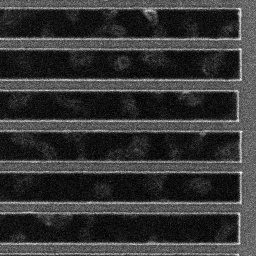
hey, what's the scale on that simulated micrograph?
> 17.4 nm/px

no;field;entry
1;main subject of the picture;parallel lines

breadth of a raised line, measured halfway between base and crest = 0.549 µm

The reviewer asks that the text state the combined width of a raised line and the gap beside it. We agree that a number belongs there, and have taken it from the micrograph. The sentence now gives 711 nm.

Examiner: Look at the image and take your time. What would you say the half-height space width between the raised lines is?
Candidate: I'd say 0.163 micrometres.